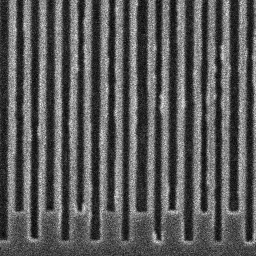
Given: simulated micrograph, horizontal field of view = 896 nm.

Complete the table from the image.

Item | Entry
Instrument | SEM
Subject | parallel lines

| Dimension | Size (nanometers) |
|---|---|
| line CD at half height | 25.8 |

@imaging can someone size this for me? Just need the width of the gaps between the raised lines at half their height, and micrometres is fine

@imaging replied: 0.0262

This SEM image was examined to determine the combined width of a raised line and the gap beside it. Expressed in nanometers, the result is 53.7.